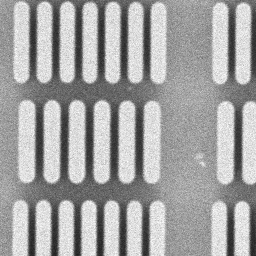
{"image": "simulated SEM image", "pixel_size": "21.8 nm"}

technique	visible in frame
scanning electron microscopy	groups of lines, slits or small figures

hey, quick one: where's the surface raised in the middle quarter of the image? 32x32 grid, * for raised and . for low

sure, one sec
**...***..****..***...***.......
**...***..****..***...***.......
**...***..****..***...***.......
**...***..****..***...***.......
**....*....**....**....*........
................................
................................
................................
................................
..**.....*.....*................
..***...***...****..****........
..***...***...****..****........
..***...***...****..****........
..***...***...****..****........
..***...***...****..****........
..***...***...****..****........
..***...***...****..****........
..***...***...****..****........
.****...***...****..****........
.****...***...****..****........
.****...***...****..****........
.****...***...****..****........
.****...***...****..****........
.****...***...****..****........
.****...***...****..****........
.****...***...****..****........
.****...***...****..****........
.****...***...****..****........
..***...***...***...****........
..**.....*.....**....**.........
................................
................................